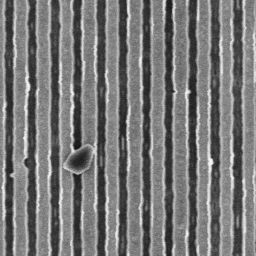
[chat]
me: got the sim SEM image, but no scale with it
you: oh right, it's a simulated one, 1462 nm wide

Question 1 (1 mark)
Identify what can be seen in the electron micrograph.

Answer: parallel lines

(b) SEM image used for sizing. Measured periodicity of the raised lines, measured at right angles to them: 131 nm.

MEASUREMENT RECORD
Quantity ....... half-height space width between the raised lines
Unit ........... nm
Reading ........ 50.7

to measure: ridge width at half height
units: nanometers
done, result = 78.6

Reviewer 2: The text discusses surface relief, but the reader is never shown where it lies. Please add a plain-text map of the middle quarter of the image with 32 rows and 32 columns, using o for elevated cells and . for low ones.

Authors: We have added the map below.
oo...ooo...oo...ooo...ooo..oooo.
oo..oooo...oo...ooo...ooo..oooo.
oo...ooo..ooo...ooo...ooo..oooo.
oo...ooo..ooo...ooo...ooo..oooo.
oo...ooo...oo...ooo...ooo..oooo.
oo..oooo...oo...oooo..ooo..oooo.
oo...ooo...oo...oooo..ooo..oooo.
oo..oooo...oo...ooo...ooo..oooo.
oo..oooo...oo...ooo...ooo..oooo.
oo..oooo...oo...oooo..ooo..oooo.
oo...ooo...oo...ooo...ooo..oooo.
oo...ooo...oo...ooo...ooo..oooo.
oo..oooo...oo...oooo..ooo..oooo.
oo..oooo...oo...oooo..ooo..oooo.
oo..oooo...oo...oooo..ooo..oooo.
oo..oooo...oo...ooo...ooo..oooo.
oo...ooo...oo...oooo..ooo..oooo.
oo...ooo...oo...ooo...ooo..oooo.
oo...ooo...oo...oooo..ooo..oooo.
oo..oooo...oo...oooo..ooo..oooo.
oo..oooo..ooo...ooo...ooo..oooo.
oo.ooooo..ooo...ooo...ooo..oooo.
oooooooo...ooo..ooo...ooo..oooo.
oooooooo...oo...ooo...ooo..oooo.
oooooooo...oo...ooo...ooo..oooo.
oooooooo...oo...ooo...ooo..oooo.
oooooooo..ooo...ooo...ooo..oooo.
oo.ooooo..ooo...ooo...ooo..oooo.
oo..oooo...oo...ooo...ooo..oooo.
oo...ooo...oo...oooo..ooo..oooo.
oo...ooo...oo...oooo..ooo..oooo.
oo...ooo...ooo..ooo...ooo..oooo.